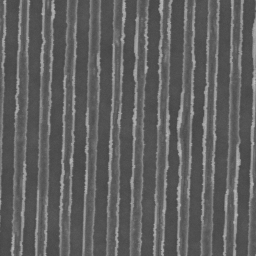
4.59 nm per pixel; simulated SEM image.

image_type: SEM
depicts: parallel lines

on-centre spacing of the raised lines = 108 nm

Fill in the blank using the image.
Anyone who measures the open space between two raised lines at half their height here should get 59.1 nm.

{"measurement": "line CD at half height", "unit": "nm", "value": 51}